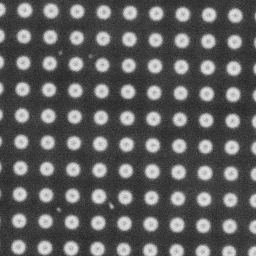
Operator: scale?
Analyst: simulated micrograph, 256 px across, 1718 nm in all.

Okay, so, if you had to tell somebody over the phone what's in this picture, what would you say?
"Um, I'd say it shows an array of small figures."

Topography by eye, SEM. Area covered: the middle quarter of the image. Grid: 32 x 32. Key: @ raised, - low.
-@@@@---@@@----@@@---@@@----@@@-
--@@-----@@----@@@---@@@----@@@-
--------------------------------
--------------------------------
--------------------------------
--@@----@@@----@@---------------
-@@@----@@@---@@@@---@@@----@@@-
-@@@----@@@---@@@@---@@@----@@@-
---------------@@----@@@----@@--
--------------------------------
--------------------------------
--------------------------------
-@@@----@@@----@@----@@@----@@--
-@@@----@@@---@@@----@@@---@@@@-
--@@----@@@---@@@----@@@---@@@--
----------------------------@---
--------------------------------
--------------------------------
-@@@----@@----------------------
-@@@---@@@@---@@@----@@@---@@@--
-@@@---@@@@---@@@----@@@---@@@--
--------@@-----@@----@@@---@@@--
--------------------------------
--------------------------------
--------------------------------
-@@@----@@----@@@----@@-----@---
-@@@---@@@@---@@@---@@@@---@@@--
-@@@---@@@----@@@---@@@@---@@@--
---------------------@@-----@@--
--------------------------------
--------------------------------
-@@-----@-----------------------